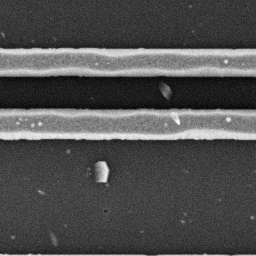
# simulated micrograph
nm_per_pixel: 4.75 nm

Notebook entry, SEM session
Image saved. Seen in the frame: lines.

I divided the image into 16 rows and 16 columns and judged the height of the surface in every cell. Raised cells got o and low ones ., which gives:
................
................
................
oooooooooooooooo
oooooooooooooooo
................
................
oooooooooooooooo
oooooooooooooooo
................
................
................
................
................
................
................